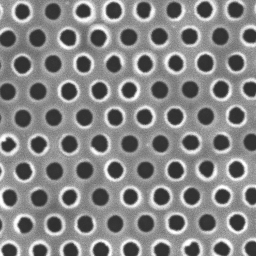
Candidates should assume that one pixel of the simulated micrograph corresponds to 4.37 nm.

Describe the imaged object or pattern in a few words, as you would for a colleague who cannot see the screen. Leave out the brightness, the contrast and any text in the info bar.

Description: a regular array of holes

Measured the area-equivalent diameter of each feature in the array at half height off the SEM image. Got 72.3 nm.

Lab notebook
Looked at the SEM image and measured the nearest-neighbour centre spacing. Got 0.131 microns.